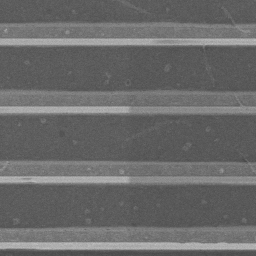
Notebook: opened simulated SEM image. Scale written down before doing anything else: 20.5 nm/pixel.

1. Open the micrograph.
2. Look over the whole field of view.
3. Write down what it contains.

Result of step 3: lines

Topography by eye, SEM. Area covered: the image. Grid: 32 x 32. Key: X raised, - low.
--------------------------------
--------------------------------
--------------------------------
XXXXXXXXXXXXXXXXXXXXXXXXXXXXXXXX
XXXXXXXXXXXXXXXXXXXXXXXXXXXXXXXX
XXXXXXXXXXXXXXXXXXXXXXXXXXXXXXXX
--------------------------------
--------------------------------
--------------------------------
--------------------------------
--------------------------------
--------------------------------
XXXXXXXXXXXXXXXXXXXXXXXXXXXXXXXX
XXXXXXXXXXXXXXXXXXXXXXXXXXXXXXXX
--------------------------------
--------------------------------
--------------------------------
--------------------------------
--------------------------------
--------------------------------
XX-----------------------------X
XXXXXXXXXXXXXXXXXXXXXXXXXXXXXXXX
XXXXXXXXXXXXXXXXXXXXXXXXXXXXXXXX
--------------------------------
--------------------------------
--------------------------------
--------------------------------
--------------------------------
--------------------------------
XXXXXXXXXXXXXXXXXXXXXXXXXXXXXXXX
XXXXXXXXXXXXXXXXXXXXXXXXXXXXXXXX
--------------------------------